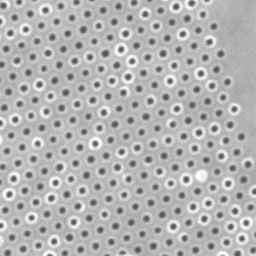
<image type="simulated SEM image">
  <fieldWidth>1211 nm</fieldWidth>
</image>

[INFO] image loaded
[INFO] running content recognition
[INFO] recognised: a regular array of holes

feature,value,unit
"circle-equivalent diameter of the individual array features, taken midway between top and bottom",7.15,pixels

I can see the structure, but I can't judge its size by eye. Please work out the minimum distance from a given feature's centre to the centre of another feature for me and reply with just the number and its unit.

0.0748 micrometres